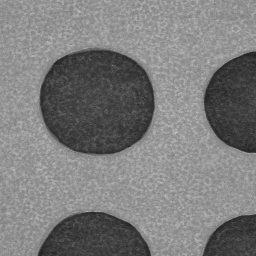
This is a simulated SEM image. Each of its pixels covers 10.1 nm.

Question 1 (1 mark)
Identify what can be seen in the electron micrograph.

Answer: holes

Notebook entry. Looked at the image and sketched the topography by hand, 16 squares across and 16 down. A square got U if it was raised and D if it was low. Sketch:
UUUUUUUUUUUUUUUU
UUUUUUUUUUUUUUUU
UUUUUUUUUUUUUUUU
UUUUDDDDUUUUUUUD
UUUDDDDDDUUUUUDD
UUUDDDDDDDUUUDDD
UUUDDDDDDDUUUDDD
UUUDDDDDDUUUUDDD
UUUDDDDDDUUUUUDD
UUUUUDDUUUUUUUUU
UUUUUUUUUUUUUUUU
UUUUUUUUUUUUUUUU
UUUUUUUUUUUUUUUU
UUUUUDDUUUUUUUUD
UUUDDDDDDUUUUDDD
UUUDDDDDDUUUUDDD